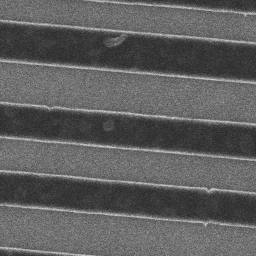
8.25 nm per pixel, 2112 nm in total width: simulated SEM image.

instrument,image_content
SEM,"one or a few lines or trenches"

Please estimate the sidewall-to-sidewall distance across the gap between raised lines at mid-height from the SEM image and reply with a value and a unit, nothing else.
272 nanometres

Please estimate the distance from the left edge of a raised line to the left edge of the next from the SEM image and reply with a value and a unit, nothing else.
605 nanometres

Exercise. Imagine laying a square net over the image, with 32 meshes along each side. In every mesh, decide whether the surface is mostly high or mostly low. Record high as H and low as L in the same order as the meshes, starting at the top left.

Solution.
LLLLLLLLLLLLLLLLLLHHHHHHHHHHHHHH
LLLLLLLLLLLLLLLLLLLLLLLLLLLLLHHH
LLLLLLLLLLLLLLLLLLLLLLLLLLLLLLLL
HHHHHHHHHHHLLLLLLLLLLLLLLLLLLLLL
HHHHHHHHHHHHHHHHHHHHHHLLLLLLLLLL
HHHHHHHHHHHHHHHHHHHHHHHHHHHHHHHH
HHHHHHHHHHHHHHHHHHHHHHHHHHHHHHHH
HHHHHHHHHHHHHHHHHHHHHHHHHHHHHHHH
LLLLLLLLLLHHHHHHHHHHHHHHHHHHHHHH
LLLLLLLLLLLLLLLLLLLLLLHHHHHHHHHH
LLLLLLLLLLLLLLLLLLLLLLLLLLLLLLLL
LLLLLLLLLLLLLLLLLLLLLLLLLLLLLLLL
LLLLLLLLLLLLLLLLLLLLLLLLLLLLLLLL
HHHHHHHHLLLLLLLLLLLLLLLLLLLLLLLL
HHHHHHHHHHHHHHHHHHHLLLLLLLLLLLLL
HHHHHHHHHHHHHHHHHHHHHHHHHHHHHHHL
HHHHHHHHHHHHHHHHHHHHHHHHHHHHHHHH
LLLLHHHHHHHHHHHHHHHHHHHHHHHHHHHH
LLLLLLLLLLLLLLLHHHHHHHHHHHHHHHHH
LLLLLLLLLLLLLLLLLLLLLLLLLLHHHHHH
LLLLLLLLLLLLLLLLLLLLLLLLLLLLLLLL
HLLLLLLLLLLLLLLLLLLLLLLLLLLLLLLL
HHHHHHHHHHHHHLLLLLLLLLLLLLLLLLLL
HHHHHHHHHHHHHHHHHHHHHHHHLLLLLLLL
HHHHHHHHHHHHHHHHHHHHHHHHHHHHHHHH
HHHHHHHHHHHHHHHHHHHHHHHHHHHHHHHH
LLLLLLLLLHHHHHHHHHHHHHHHHHHHHHHH
LLLLLLLLLLLLLLLLLLLLLHHHHHHHHHHH
LLLLLLLLLLLLLLLLLLLLLLLLLLLLLLLL
LLLLLLLLLLLLLLLLLLLLLLLLLLLLLLLL
LLLLLLLLLLLLLLLLLLLLLLLLLLLLLLLL
HHHHHHLLLLLLLLLLLLLLLLLLLLLLLLLL